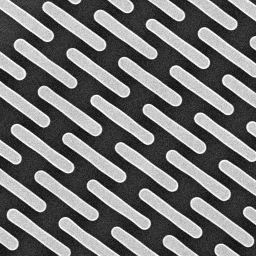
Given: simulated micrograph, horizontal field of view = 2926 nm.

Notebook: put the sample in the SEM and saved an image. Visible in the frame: groups of lines, slits or small figures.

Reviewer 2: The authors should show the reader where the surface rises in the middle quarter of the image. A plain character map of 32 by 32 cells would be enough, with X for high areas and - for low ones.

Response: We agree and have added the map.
----XXXXX-----XXXXX-------------
-----XXXXX-----XXXXX-------XXX--
X------XXXXX----XXXXX------XXXXX
XXX-----XXXXX-----XXXXX-----XXXX
XXX------XXXXX-----XXXXX-----XXX
-XX-------XXXXXX----XXXXXX----XX
------------XXXX-----XXXXXX-----
-------------XXX-------XXXXX----
-------XXX--------------XXXXX---
X------XXXX---------------XXX---
XXX----XXXXX--------XX----------
XXXX-----XXXXX------XXXX--------
XXXXX-----XXXXX-----XXXXX-------
-XXXXXX----XXXXXX----XXXXX------
---XXXXX-----XXXXX-----XXXXX----
----XXXXX-----XXXXX-----XXXXX---
-----XXXX-------XXXXX-----XXXXX-
-X-----XX--------XXXXX-----XXXXX
XXX---------------XXXX------XXXX
XXXXX---------------XX--------XX
-XXXXX-------XXX---------------X
--XXXXX------XXXXX--------------
----XXXXX-----XXXXX-------XXX---
-----XXXXX-----XXXXX------XXXX--
XX-----XXXXX----XXXXX-----XXXXXX
XX------XXXXX-----XXXXX-----XXXX
XX-------XXXXX-----XXXXX-----XXX
----------XXXXX------XXXXX-----X
------------XXX-------XXXXX-----
------XX-----XX--------XXXXX----
------XXXX---------------XXX----
X-----XXXXX--------XX-----XX----